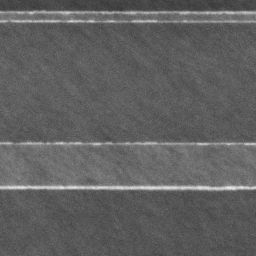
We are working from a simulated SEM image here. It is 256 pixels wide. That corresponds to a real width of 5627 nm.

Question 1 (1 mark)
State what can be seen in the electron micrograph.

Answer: lines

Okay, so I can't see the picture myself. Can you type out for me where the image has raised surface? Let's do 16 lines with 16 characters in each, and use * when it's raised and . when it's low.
................
................
................
................
................
................
................
................
................
****************
****************
****************
................
................
................
................